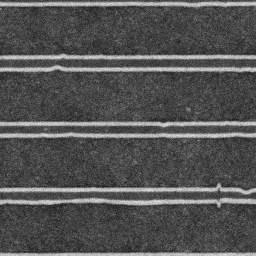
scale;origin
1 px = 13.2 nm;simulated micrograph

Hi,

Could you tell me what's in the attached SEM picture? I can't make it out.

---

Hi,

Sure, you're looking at one or a few lines or trenches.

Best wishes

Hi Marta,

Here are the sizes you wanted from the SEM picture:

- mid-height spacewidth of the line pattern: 0.701 microns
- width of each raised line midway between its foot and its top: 0.167 µm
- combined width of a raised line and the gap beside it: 873 nm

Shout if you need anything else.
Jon